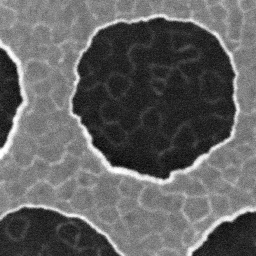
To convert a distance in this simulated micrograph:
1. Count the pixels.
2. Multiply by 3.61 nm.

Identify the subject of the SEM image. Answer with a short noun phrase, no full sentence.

holes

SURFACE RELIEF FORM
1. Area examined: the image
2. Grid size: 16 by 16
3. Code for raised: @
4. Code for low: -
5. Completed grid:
@@@@@@@@@@@@@@@@
@@@@@@@-----@@@@
@@@@@@--------@@
-@@@@---------@@
-@@@@----------@
-@@@@----------@
-@@@-----------@
-@@@@----------@
-@@@@@--------@@
@@@@@@-------@@@
@@@@@@@-----@@@@
@@@@@@@@@@@@@@@@
@@@@@@@@@@@@@@@@
-----@@@@@@@@@@-
------@@@@@@@---
-------@@@@@----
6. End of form